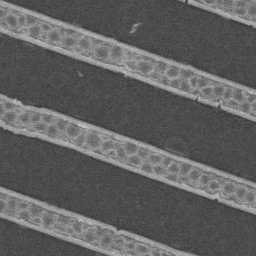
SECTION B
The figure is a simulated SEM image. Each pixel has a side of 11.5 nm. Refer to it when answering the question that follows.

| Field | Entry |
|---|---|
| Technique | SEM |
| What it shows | one or a few lines or trenches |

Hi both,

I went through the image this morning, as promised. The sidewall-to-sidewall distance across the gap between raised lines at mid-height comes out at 726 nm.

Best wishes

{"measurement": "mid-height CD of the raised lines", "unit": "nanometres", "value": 281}